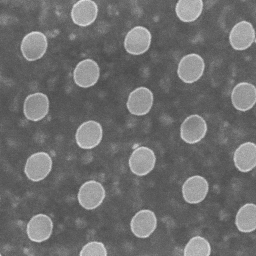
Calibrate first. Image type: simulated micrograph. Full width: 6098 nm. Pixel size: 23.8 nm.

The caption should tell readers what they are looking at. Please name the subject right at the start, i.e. a regular array of raised bodies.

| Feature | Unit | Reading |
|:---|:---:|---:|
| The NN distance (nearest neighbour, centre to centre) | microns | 1.43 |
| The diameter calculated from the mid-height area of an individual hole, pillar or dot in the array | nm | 624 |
